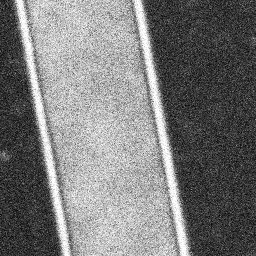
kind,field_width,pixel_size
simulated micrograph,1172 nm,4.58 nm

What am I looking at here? one or a few lines or trenches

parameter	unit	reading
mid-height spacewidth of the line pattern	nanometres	527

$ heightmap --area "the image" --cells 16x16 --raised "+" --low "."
+........+++++++
++.......+++++++
++.......+++++++
++.......+++++++
++.......+++++++
++........++++++
++........++++++
+++.......++++++
+++.......++++++
+++.......++++++
+++........+++++
+++........+++++
++++.......+++++
++++.......+++++
++++.......+++++
++++.......+++++